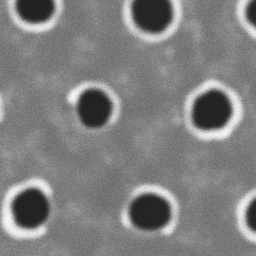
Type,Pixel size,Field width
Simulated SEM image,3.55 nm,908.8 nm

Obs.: holes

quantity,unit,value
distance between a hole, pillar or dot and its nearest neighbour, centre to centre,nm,418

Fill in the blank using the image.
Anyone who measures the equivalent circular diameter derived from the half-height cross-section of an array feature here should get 0.14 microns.